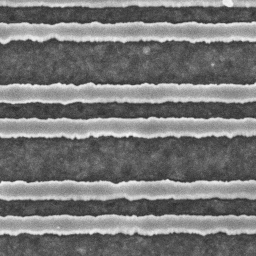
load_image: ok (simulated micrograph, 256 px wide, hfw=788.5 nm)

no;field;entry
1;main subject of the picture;lines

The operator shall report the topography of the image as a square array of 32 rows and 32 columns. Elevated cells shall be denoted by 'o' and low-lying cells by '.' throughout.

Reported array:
oooooooooooooooooooooooooooooooo
................................
................................
oooooooooooooooooooooooooooooooo
oooooooooooooooooooooooooooooooo
................................
................................
................................
................................
................................
...........o....................
oooooooooooooooooooooooooooooooo
oooooooooooooooooooooooooooooooo
................................
................................
oooooooooooooooooooooooooooooooo
oooooooooooooooooooooooooooooooo
................................
................................
................................
................................
................................
................................
oooooooooooooooooooooooooooooooo
oooooooooooooooooooooooooooooooo
................................
................................
oooooooooooooooooooooooooooooooo
oooooooooooooooooooooooooooooooo
................................
................................
................................